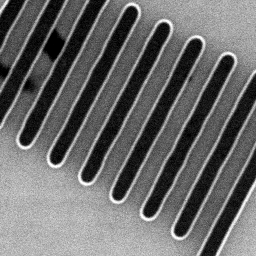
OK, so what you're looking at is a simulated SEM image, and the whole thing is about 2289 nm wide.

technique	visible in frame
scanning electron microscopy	groups of lines, slits or small figures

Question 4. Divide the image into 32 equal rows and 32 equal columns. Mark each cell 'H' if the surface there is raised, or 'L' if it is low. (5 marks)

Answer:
LHHLLLHHLLLHHLLLLLLLLLLLLLLLLLLL
HHHLLHHHLLHHHLLHHLLLLLLLLLLLLLLL
HHLLLHHLLLHHLLLHHLLLLLLLLLLLLLLL
HHLLHHHLLHHHLLHHHLLHHLLLLLLLLLLL
HLLLHHLLLHHLLLHHLLLHHLLLLLLLLLLL
HLLHHHLLHHHLLHHHLLHHHLLHHLLLLLLL
LLLHHLLLHHLLLHHLLLHHLLLHHLLLLLLL
LLHHLLLHHHLLHHHLLHHHLLHHHLLHHLLL
LLHHLLLHHLLLHHLLLHHLLLHHLLLHHLLL
LHHLLLHHHLLHHHLLHHHLLHHHLLHHHLLH
HHHLLLHHLLLHHLLLHHLLLHHLLLHHLLLH
HHLLLHHHLLHHHLLHHHLLHHHLLHHHLLHH
HHLLLHHLLLHHLLLHHLLLHHLLLHHLLLHH
HLLLHHLLLHHLLLHHHLLHHHLLHHHLLHHH
HLLHHHLLLHHLLLHHLLLHHLLLHHLLLHHL
LLLHHLLLHHLLLHHHLLHHHLLHHHLLHHHL
LLLHHLLLHHLLLHHLLLHHLLLHHLLLHHLL
LLHHLLLHHLLLHHLLLHHHLLHHHLLHHHLL
LLLLLLHHHLLHHHLLLHHLLLHHLLLHHLLL
LLLLLLHHLLLHHLLLHHLLLHHLLLHHHLLH
LLLLLLHHLLLHHLLHHHLLHHHLLLHHLLLH
LLLLLLLLLLHHLLLHHLLLHHLLLHHLLLHH
LLLLLLLLLLHHLLHHHLLLHHLLLHHLLLHH
LLLLLLLLLLLLLLHHLLLHHLLLHHLLLHHH
LLLLLLLLLLLLLLHHLLLHHLLHHHLLLHHL
LLLLLLLLLLLLLLLLLLHHLLLHHLLLHHLL
LLLLLLLLLLLLLLLLLLHHLLHHHLLLHHLL
LLLLLLLLLLLLLLLLLLLLLLHHLLLHHLLL
LLLLLLLLLLLLLLLLLLLLLLHHLLHHHLLL
LLLLLLLLLLLLLLLLLLLLLLHLLLHHLLLL
LLLLLLLLLLLLLLLLLLLLLLLLLHHHLLLL
LLLLLLLLLLLLLLLLLLLLLLLLLHHLLLLL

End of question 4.